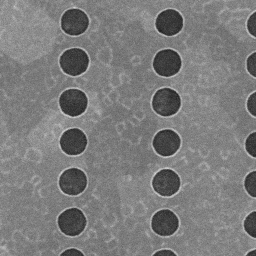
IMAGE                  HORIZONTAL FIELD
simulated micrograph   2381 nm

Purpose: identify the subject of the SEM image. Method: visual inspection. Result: a regular array of holes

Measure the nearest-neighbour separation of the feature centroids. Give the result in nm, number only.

370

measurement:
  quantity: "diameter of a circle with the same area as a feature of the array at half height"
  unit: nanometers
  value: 264